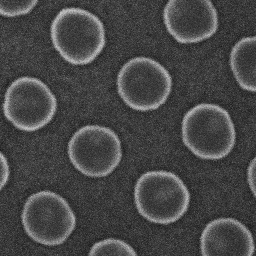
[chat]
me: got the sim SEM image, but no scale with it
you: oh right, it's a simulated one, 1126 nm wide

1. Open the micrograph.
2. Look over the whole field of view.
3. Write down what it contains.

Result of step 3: raised bodies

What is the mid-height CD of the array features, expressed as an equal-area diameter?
227 nanometers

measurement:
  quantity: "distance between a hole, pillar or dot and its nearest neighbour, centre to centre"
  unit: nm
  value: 355